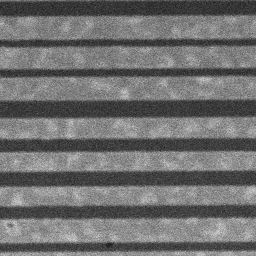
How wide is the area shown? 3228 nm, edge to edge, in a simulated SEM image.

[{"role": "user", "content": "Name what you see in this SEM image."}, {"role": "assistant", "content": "parallel lines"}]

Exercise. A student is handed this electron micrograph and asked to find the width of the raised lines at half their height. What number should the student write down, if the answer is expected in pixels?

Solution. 21.1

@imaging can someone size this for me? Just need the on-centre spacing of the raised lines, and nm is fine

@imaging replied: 427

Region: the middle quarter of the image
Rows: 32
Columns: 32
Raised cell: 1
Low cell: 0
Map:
11111111111111111111111110111111
00000000000000000000000000000000
00000000000000000000000000000000
11111111111111111110011111111111
11111111111111111111111111111111
11111111111111111111111111111111
11111111111111111111111111111111
11111111111111111111111111111111
11111111111111111111111111111111
00000000000000000000000000000000
00000000000000000000000000000000
00000000000000000000000000000000
00000000000000000000000000000000
00000000000000000000000000000000
11111111111111111111111111111111
10111111111111111111111111111111
11111111111111101111111111111111
11111111111111111011111111111111
00000000000000000000000000000000
00000000000000000000000000000000
00000000000000000000000000000000
00000000000000000000000000000000
11111111111111111111111111111111
11111111111111111111111111111111
11111111111111111111111111111111
11111111111111111111111111111111
11111111111111111111111111111000
00000000000000000000000000000000
00000000000000000000000000000000
00000000000000000000000000000000
00000000000000000000000000000000
11111111111111111111111111111111